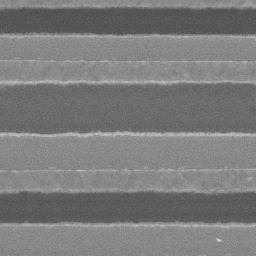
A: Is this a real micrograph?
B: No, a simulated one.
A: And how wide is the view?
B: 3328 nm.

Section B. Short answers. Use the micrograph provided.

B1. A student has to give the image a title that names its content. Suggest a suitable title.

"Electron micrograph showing lines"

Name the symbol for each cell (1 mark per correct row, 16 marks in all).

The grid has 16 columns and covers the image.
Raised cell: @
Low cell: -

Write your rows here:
----------------
----------------
@@@@@@@@@@@@@@@@
@@@@@@@@@@@@@@@@
@@@@@@@@@@@@@@@@
----------------
----------------
----------------
@@@@@@@@@@@@@@@@
@@@@@@@@@@@@@@@@
@@@@@@@@@@@@@@@@
@@@@@@@@@@@@@@@@
----------------
----------------
@@@@@@@@@@@@@@@@
@@@@@@@@@@@@@@@@